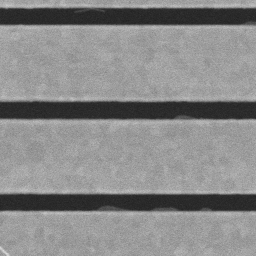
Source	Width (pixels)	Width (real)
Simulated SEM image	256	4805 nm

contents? lines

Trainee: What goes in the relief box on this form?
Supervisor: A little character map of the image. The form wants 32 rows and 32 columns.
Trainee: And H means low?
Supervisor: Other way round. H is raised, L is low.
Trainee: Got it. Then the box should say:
HHHHHHHHHHHHHHHHHHHHHHHHHHHHHHHH
LLLLLLLLLLLLLLLLLLLLLLLLLLLLLLLL
LLLLLLLLLLLLLLLLLLLLLLLLLLLLLLLL
HHHHHHHHHHHHHHHHHHHHHHHHHHHHHHHH
HHHHHHHHHHHHHHHHHHHHHHHHHHHHHHHH
HHHHHHHHHHHHHHHHHHHHHHHHHHHHHHHH
HHHHHHHHHHHHHHHHHHHHHHHHHHHHHHHH
HHHHHHHHHHHHHHHHHHHHHHHHHHHHHHHH
HHHHHHHHHHHHHHHHHHHHHHHHHHHHHHHH
HHHHHHHHHHHHHHHHHHHHHHHHHHHHHHHH
HHHHHHHHHHHHHHHHHHHHHHHHHHHHHHHH
HHHHHHHHHHHHHHHHHHHHHHHHHHHHHHHH
HHHHHHHHHHHHHHHHHHHHHHHHHHHHHHHH
LLLLLLLLLLLLLLLLLLLLLLLLLLLLLLLL
LLLLLLLLLLLLLLLLLLLLLLLLLLLLLLLL
HHHHHHHHHHHHHHHHHHHHHHHHHHHHHHHH
HHHHHHHHHHHHHHHHHHHHHHHHHHHHHHHH
HHHHHHHHHHHHHHHHHHHHHHHHHHHHHHHH
HHHHHHHHHHHHHHHHHHHHHHHHHHHHHHHH
HHHHHHHHHHHHHHHHHHHHHHHHHHHHHHHH
HHHHHHHHHHHHHHHHHHHHHHHHHHHHHHHH
HHHHHHHHHHHHHHHHHHHHHHHHHHHHHHHH
HHHHHHHHHHHHHHHHHHHHHHHHHHHHHHHH
HHHHHHHHHHHHHHHHHHHHHHHHHHHHHHHH
LLLLLLLLLLLLLLLLLLLLLLLLLLLLLLLL
LLLLLLLLLLLLLLLLLLLLLLLLLLLLLLLL
HHHHHHHHHHHHHHHHHHHHHHHHHHHHHHHH
HHHHHHHHHHHHHHHHHHHHHHHHHHHHHHHH
HHHHHHHHHHHHHHHHHHHHHHHHHHHHHHHH
HHHHHHHHHHHHHHHHHHHHHHHHHHHHHHHH
HHHHHHHHHHHHHHHHHHHHHHHHHHHHHHHH
HHHHHHHHHHHHHHHHHHHHHHHHHHHHHHHH